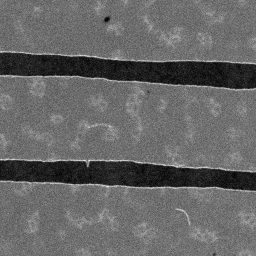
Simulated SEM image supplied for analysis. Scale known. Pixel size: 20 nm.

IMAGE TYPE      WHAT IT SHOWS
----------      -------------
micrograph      one or a few lines or trenches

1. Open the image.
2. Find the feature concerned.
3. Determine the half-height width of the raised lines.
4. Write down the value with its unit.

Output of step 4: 454 nm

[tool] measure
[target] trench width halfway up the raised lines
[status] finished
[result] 1.62 microns